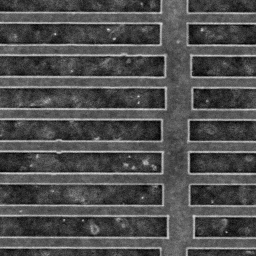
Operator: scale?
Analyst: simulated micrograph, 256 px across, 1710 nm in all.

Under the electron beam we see parallel lines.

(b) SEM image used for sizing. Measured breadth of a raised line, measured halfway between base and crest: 69.3 nanometers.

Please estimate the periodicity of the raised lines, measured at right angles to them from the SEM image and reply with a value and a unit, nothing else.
214 nm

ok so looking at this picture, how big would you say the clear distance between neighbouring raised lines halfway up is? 146 nm